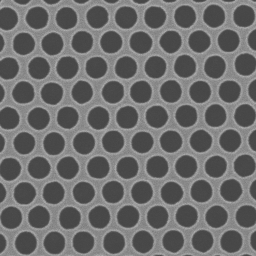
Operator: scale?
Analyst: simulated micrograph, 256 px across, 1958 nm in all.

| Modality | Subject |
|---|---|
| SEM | a regular array of holes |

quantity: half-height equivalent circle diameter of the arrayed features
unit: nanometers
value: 170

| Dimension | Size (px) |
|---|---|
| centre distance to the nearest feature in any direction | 28.4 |